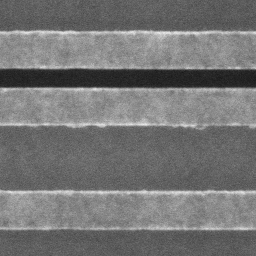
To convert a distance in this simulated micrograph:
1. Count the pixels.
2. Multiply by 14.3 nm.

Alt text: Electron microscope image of lines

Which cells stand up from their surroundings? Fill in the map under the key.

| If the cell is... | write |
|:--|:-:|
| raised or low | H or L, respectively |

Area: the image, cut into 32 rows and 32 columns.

LLLLLLLLLLLLLLLLLLLLLLLLLLLLLLLL
LLLLLLLLLLLLLLLLLLLLLLLLLLLLLLLL
LLLLLLLLLLLLLLLLLLLLLLLLLLLLLLLL
LLLLLLLLLLLLLLLLLLLLLLLLLLLLLLLL
HHHHHHHHHHHHHHHHHHHHHHHHHHHHHHHH
HHHHHHHHHHHHHHHHHHHHHHHHHHHHHHHH
HHHHHHHHHHHHHHHHHHHHHHHHHHHHHHHH
HHHHHHHHHHHHHHHHHHHHHHHHHHHHHHHH
HHHHHHHHHLLHHHHHHHHHHHHHHHHHHHHH
LLLLLLLLLLLLLLLLLLLLLLLLLLLLLLLL
LLLLLLLLLLLLLLLLLLLLLLLLLLLLLLLL
HHHHHHHHHHHHHHHHHHHHHHHHHHHHHHHH
HHHHHHHHHHHHHHHHHHHHHHHHHHHHHHHH
HHHHHHHHHHHHHHHHHHHHHHHHHHHHHHHH
HHHHHHHHHHHHHHHHHHHHHHHHHHHHHHHH
HHHHHHHHHHHHHHHHHHHHHHHHHHHHHHHH
LLLLLLLLLLLLLLLLLLLLLLLLLLLLLLLL
LLLLLLLLLLLLLLLLLLLLLLLLLLLLLLLL
LLLLLLLLLLLLLLLLLLLLLLLLLLLLLLLL
LLLLLLLLLLLLLLLLLLLLLLLLLLLLLLLL
LLLLLLLLLLLLLLLLLLLLLLLLLLLLLLLL
LLLLLLLLLLLLLLLLLLLLLLLLLLLLLLLL
LLLLLLLLLLLLLLLLLLLLLLLLLLLLLLLL
LLLLLLLLLLLLLLLLLLLLLLLLLLLLLLLL
HHHHHHHHHHHHHHHHHHHHHHHHHHHHHHHH
HHHHHHHHHHHHHHHHHHHHHHHHHHHHHHHH
HHHHHHHHHHHHHHHHHHHHHHHHHHHHHHHH
HHHHHHHHHHHHHHHHHHHHHHHHHHHHHHHH
HHHHHHHHHHHHHHHHHHHHHHHHHHHHHHHH
LLLLLLLLLLLLLLLLLLLLLLLLLLLLLLLL
LLLLLLLLLLLLLLLLLLLLLLLLLLLLLLLL
LLLLLLLLLLLLLLLLLLLLLLLLLLLLLLLL